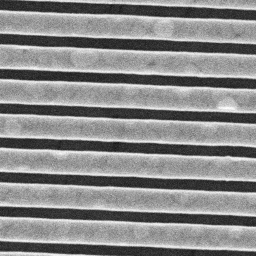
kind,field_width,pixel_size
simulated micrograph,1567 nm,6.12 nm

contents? parallel lines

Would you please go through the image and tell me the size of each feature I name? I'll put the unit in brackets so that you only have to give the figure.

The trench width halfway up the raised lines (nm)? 70.4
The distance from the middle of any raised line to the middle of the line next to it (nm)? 211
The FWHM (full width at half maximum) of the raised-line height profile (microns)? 0.14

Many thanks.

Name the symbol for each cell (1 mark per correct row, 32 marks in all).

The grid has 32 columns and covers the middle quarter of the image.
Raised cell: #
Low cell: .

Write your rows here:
################################
################################
.....................###########
................................
................................
######################..........
################################
################################
################################
################################
.......#########################
............................##..
................................
#####...........................
##############################..
################################
################################
################################
################################
.................##....#########
................................
................................
###############.................
################################
################################
################################
################################
...#############################
...........................####.
................................
#...............................
#########################.......